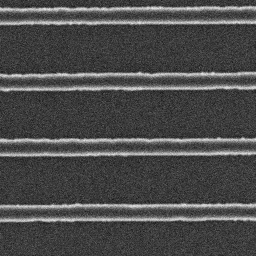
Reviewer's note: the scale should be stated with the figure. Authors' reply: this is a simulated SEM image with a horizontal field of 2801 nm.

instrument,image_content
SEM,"lines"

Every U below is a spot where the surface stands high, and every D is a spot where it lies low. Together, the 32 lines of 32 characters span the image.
DDDDDDDDDDDDDDDDDDDDDDDDDDDDDDDD
UUUUUUUUUUUUUUUUUUUUUUUUUUUUUUUU
UUUUUUUUUUUUUUUUUUUUUUUUUUUUUUUU
DDDDDDDDDDDDDDDDDDDDDDDDDDDDDDDD
DDDDDDDDDDDDDDDDDDDDDDDDDDDDDDDD
DDDDDDDDDDDDDDDDDDDDDDDDDDDDDDDD
DDDDDDDDDDDDDDDDDDDDDDDDDDDDDDDD
DDDDDDDDDDDDDDDDDDDDDDDDDDDDDDDD
DDDDDDDDDDDDDDDDDDDDDDDDDDDDDDDD
UUUUUUUUUUUUUUUUUUUUUUUUUUUUUUUU
UUUUUUUUUUUUUUUUUUUUUUUUUUUUUUUU
DDDDDDDDDDDDDDDDDDDDDDDDDDDDDDDD
DDDDDDDDDDDDDDDDDDDDDDDDDDDDDDDD
DDDDDDDDDDDDDDDDDDDDDDDDDDDDDDDD
DDDDDDDDDDDDDDDDDDDDDDDDDDDDDDDD
DDDDDDDDDDDDDDDDDDDDDDDDDDDDDDDD
DDDDDDDDDDDDDDDDDDDDDDDDDDDDDDDD
UDUUUUUUUUUUUUUUUUUUUUUUUUUUUUUU
UUUUUUUUUUUUUUUUUUUUUUUUUUUUUUUU
DDDDDDDDDDDDDDDDDDDDDDDDDDDDDDDD
DDDDDDDDDDDDDDDDDDDDDDDDDDDDDDDD
DDDDDDDDDDDDDDDDDDDDDDDDDDDDDDDD
DDDDDDDDDDDDDDDDDDDDDDDDDDDDDDDD
DDDDDDDDDDDDDDDDDDDDDDDDDDDDDDDD
DDDDDDDDDDDDDDDDDDDDDDDDDDDDDDDD
DDDDDDDDDDDDDDDDDDDDDDDDDDDDDDDD
UUUUUUUUUUUUUUUUUUUUUUUUUUUUUUUU
UUUUUUUUUUUUUUUUUUUUUUUUUUDDDUUU
DDDDDDDDDDDDDDDDDDDDDDDDDDDDDDDD
DDDDDDDDDDDDDDDDDDDDDDDDDDDDDDDD
DDDDDDDDDDDDDDDDDDDDDDDDDDDDDDDD
DDDDDDDDDDDDDDDDDDDDDDDDDDDDDDDD